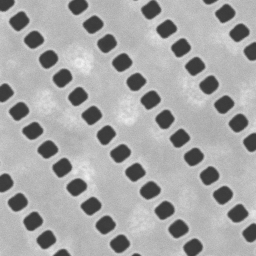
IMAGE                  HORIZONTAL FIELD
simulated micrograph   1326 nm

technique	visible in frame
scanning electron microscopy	a regular array of holes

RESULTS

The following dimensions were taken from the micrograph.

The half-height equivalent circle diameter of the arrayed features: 93.6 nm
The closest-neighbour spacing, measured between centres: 121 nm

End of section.